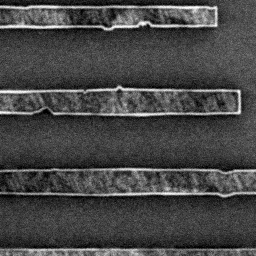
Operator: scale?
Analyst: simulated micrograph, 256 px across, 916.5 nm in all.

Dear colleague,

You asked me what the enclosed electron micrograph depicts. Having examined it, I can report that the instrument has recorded one or a few lines or trenches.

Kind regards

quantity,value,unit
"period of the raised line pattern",294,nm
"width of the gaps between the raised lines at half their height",202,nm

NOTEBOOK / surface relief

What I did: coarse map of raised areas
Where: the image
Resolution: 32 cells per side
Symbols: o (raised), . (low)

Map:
................................
ooooooooooooooooooooooooooo.....
ooooooooooooooooooooooooooo.....
.............o..................
................................
................................
................................
................................
................................
................................
................................
.....ooooooooooooooooooooooooo..
oooooooooooooooooooooooooooooo..
oooooooooooooooooooooooooooooo..
................................
................................
................................
................................
................................
................................
................................
oooooooooooooooooooooooooooo.ooo
oooooooooooooooooooooooooooooooo
oooooooooooooooooooooooooooooooo
............................o...
................................
................................
................................
................................
................................
................................
oooooooooooooooooooooooooooooooo